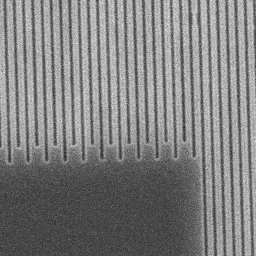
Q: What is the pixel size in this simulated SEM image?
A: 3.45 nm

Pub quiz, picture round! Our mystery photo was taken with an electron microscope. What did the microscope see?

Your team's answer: parallel lines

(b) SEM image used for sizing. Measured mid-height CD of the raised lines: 0.0185 microns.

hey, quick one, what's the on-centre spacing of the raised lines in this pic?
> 9.22 px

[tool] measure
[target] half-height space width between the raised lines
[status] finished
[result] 3.62 px